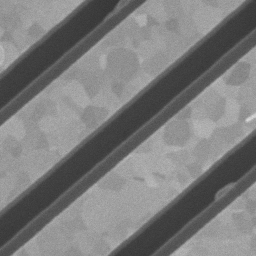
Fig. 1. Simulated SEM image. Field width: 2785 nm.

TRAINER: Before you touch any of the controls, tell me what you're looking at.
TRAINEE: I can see lines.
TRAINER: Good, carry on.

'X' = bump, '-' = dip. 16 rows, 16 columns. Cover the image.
XXXXX----XXXXXX-
XXXX---XXXXXXX--
XX----XXXXXX----
X----XXXXXX----X
----XXXXXX----XX
---XXXXXX----XXX
--XXXXXX----XXXX
XXXXXXX----XXXXX
XXXXX----XXXXXX-
XXXX----XXXXXX--
XXX----XXXXXX---
XX----XXXXXX----
X----XXXXXX----X
----XXXXXX---XXX
--XXXXXX----XXXX
-XXXXXX----XXXXX